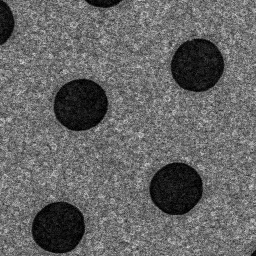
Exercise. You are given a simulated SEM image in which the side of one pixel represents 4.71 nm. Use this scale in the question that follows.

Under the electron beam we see holes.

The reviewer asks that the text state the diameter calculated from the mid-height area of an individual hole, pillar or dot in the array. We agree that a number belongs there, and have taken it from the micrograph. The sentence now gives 0.249 um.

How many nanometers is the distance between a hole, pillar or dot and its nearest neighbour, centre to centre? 582